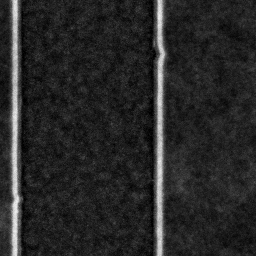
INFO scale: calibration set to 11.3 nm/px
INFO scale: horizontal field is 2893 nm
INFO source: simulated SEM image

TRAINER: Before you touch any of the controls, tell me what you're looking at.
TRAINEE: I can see one or a few lines or trenches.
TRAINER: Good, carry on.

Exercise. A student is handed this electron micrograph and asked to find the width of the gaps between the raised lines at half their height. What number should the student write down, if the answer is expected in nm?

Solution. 1630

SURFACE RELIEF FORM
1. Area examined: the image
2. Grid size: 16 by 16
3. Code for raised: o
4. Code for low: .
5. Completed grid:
o.........oooooo
o.........oooooo
o.........oooooo
o.........oooooo
o.........oooooo
o.........oooooo
o.........oooooo
o.........oooooo
o.........oooooo
o.........oooooo
o.........oooooo
o.........oooooo
o.........oooooo
o.........oooooo
o.........oooooo
o.........oooooo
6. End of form